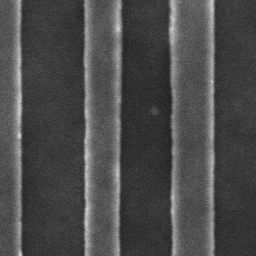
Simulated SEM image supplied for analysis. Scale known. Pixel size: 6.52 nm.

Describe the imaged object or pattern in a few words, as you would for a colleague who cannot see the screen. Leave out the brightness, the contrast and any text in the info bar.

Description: lines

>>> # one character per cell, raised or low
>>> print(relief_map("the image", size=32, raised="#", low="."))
##.........####.......####......
##.........####.......####......
##.........####.......####......
##.........####.......####......
##.........####.......####......
##.........####.......#####.....
##.........####.......#####.....
##.........####.......####......
##.........####.......####......
##.........####.......####......
##.........####.......#####.....
##.........####.......####......
##.........####.......####......
##.........####.......####......
##.........####.......####......
##.........####.......####......
##.........####.......####......
##.........####.......####......
##.........####.......####......
##.........####.......####......
##.........####.......####......
##.........####.......####......
##.........####.......####......
##.........####.......####......
##.........####.......####......
##.........####.......####......
##.........####.......#####.....
##.........####.......####......
##.........####.......####......
##.........####.......####......
##.........####.......####......
###........####.......####......